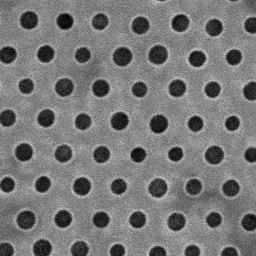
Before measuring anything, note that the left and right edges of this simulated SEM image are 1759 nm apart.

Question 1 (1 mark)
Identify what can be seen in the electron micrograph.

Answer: a regular array of holes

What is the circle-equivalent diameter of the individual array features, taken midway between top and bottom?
125 nm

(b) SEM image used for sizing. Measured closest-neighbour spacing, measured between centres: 0.25 um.